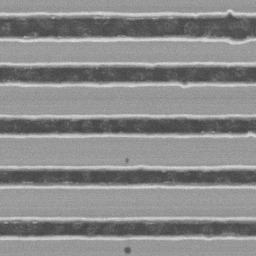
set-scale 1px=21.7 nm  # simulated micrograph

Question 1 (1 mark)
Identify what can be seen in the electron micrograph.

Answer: parallel lines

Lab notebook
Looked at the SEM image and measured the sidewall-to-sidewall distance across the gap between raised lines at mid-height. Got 429 nanometres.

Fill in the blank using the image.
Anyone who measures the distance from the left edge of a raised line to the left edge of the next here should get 50.3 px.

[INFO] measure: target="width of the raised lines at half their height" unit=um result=0.701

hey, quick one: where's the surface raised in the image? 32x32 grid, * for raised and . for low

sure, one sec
********************************
********************************
................................
................................
................................
********************************
********************************
********************************
................................
................................
.*...................*..........
********************************
********************************
********************************
*****.********....****..*****...
................................
................................
********************************
********************************
********************************
********************************
................................
................................
********************************
********************************
********************************
********************************
................................
................................
................................
********************************
********************************